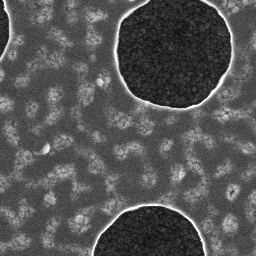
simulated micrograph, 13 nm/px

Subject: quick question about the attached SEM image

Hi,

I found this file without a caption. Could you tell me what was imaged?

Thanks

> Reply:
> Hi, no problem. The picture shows holes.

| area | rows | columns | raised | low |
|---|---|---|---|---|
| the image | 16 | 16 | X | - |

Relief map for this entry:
XXXXXXXXX----XXX
-XXXXXXX------XX
-XXXXXX-------XX
XXXXXXX-------XX
XXXXXXX-------XX
XXXXXXXX-----XXX
XXXXXXXXXX--XXXX
XXXXXXXXXXXXXXXX
XXXXXXXXXXXXXXXX
XXXXXXXXXXXXXXXX
XXXXXXXXXXXXXXXX
XXXXXXXXXXXXXXXX
XXXXXXXXXXXXXXXX
XXXXXXX----XXXXX
XXXXXX------XXXX
XXXXXX-------XXX